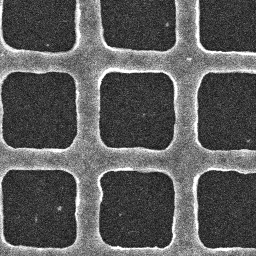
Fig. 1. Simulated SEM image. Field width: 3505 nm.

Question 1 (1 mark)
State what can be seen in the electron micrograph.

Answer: holes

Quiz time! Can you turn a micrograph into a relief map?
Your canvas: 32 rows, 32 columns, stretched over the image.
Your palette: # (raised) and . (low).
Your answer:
..........##..........###.......
..........###.........###.......
..........###.........###.......
..........###.........###.......
..........###.........###.......
#........####.........###.......
#####....######################.
################################
################################
#........####........#####......
..........###.........###.......
..........##..........###.......
..........##..........###.......
..........##..........###.......
..........##..........###.......
..........##..........###.......
..........##..........###.......
#........####.........###.......
##......######...#...#####......
################################
################################
#.......#####.......######....##
.........####.........###.......
..........###.........###.......
.........####.........###.......
.........####.........###.......
.........###..........###.......
..........##..........###.......
..........##..........###.......
..........###.........###.......
#........####........####.......
################################